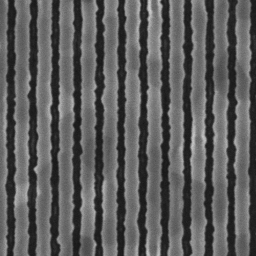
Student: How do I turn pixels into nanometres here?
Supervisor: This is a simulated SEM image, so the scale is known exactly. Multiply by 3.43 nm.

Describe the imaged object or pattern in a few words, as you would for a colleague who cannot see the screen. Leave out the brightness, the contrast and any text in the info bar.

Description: parallel lines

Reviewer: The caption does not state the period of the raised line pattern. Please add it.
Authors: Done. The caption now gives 75.6 nm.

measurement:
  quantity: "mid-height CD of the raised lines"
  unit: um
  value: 0.0475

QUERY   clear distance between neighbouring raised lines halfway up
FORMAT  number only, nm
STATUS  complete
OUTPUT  27